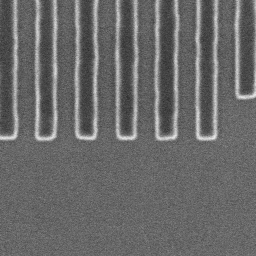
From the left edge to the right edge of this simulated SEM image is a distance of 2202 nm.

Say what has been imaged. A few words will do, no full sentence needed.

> wiring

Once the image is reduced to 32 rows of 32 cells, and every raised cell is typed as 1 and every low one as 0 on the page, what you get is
11000110001100011000110001100011
11000110001100011000110001100011
11000110001100011000110001100011
11000110001100011000110001100011
11000110001100011000110001100011
11000110001100011000110001100011
11000110001100011000110001100011
11000110001100011001110001100011
11000110001100011001110001100011
11000110001100011001110001100011
11000110001100011001110001100011
11000110001100011001110001100011
11000110001100011000110001100000
11000110001100011001110001100000
11000110001100011001110001100000
11000110001100011000110001100000
11000110001100011000110001100000
00000000000000000000000000000000
00000000000000000000000000000000
00000000000000000000000000000000
00000000000000000000000000000000
00000000000000000000000000000000
00000000000000000000000000000000
00000000000000000000000000000000
00000000000000000000000000000000
00000000000000000000000000000000
00000000000000000000000000000000
00000000000000000000000000000000
00000000000000000000000000000000
00000000000000000000000000000000
00000000000000000000000000000000
00000000000000000000000000000000